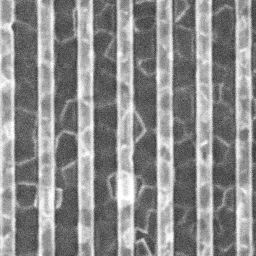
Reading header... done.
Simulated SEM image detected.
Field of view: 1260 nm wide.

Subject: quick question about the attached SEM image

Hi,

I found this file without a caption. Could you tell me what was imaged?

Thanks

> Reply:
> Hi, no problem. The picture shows parallel lines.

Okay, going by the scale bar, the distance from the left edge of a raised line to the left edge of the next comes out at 194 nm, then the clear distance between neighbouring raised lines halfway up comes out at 130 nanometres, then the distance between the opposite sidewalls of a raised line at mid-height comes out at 62.1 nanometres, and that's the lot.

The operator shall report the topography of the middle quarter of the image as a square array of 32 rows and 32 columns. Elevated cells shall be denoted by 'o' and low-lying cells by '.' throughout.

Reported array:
....ooo.......ooo......oooo.....
....ooo.......ooo......oooo.....
....ooo.......ooo......oooo.....
....ooo.......ooo......oooo.....
....ooo.......ooo.......ooo.....
....ooo.......ooo.......ooo.....
....ooo.......ooo.......ooo.....
....ooo.......ooo.......ooo.....
....ooo.......ooo.......ooo.....
....ooo.......ooo.......ooo.....
....ooo.......ooo.......ooo.....
....ooo.......ooo.......ooo.....
....ooo.......ooo.......ooo.....
....ooo.......ooo.......ooo.....
....ooo.......ooo.......ooo.....
....ooo.......ooo.......ooo.....
....ooo.......ooo.......ooo.....
....ooo.......ooo.......ooo.....
....ooo.......ooo.......ooo.....
....ooo.......ooo.......ooo.....
....ooo.......ooo.......ooo.....
....ooo.......ooo.......ooo.....
....ooo.......ooo.......ooo.....
....ooo.......ooo.......ooo.....
....ooo.......ooo.......ooo.....
....ooo.......ooo.......ooo.....
....ooo.......ooo.......ooo.....
....ooo.......ooo.......ooo.....
....ooo.......ooo.......ooo.....
....ooo.......ooo.......ooo.....
....ooo.......ooo.......ooo.....
....ooo.......ooo.......ooo.....